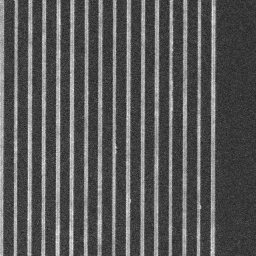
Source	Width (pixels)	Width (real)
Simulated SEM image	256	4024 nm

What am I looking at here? parallel lines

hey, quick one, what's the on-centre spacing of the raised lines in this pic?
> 222 nanometres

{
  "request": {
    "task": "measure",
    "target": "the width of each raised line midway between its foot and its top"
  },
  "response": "53.1 nm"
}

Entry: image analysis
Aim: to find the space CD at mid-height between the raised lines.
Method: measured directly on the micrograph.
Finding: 175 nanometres